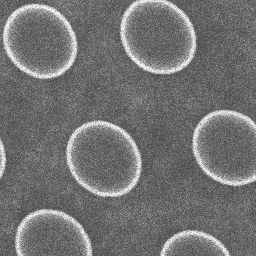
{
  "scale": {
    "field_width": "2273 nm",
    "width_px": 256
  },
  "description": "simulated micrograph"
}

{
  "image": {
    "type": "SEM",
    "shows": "raised bodies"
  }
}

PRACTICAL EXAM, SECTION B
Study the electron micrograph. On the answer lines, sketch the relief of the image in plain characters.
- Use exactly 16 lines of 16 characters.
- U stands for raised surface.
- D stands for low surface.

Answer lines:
DDUDDDDDUUUDDDDD
UUUUDDDDUUUUDDDD
UUUUUDDDUUUUDDDD
DUUUUDDDUUUUDDDD
DDUUDDDDDDDDDDDD
DDDDDDDDDDDDDDDD
DDDDDDDDDDDDDDDD
DDDDDDDDDDDDDUUD
DDDDDUUUDDDDUUUU
DDDDUUUUUDDDUUUU
DDDDUUUUUDDDDUUU
DDDDDUUUDDDDDDDD
DDDDDDDDDDDDDDDD
DDUUDDDDDDDDDDDD
DUUUUDDDDDDDDDDD
DUUUUUDDDDUUUUDD